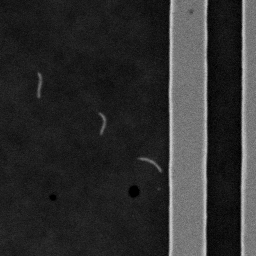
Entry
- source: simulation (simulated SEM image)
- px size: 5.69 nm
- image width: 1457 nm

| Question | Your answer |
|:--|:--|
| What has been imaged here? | wiring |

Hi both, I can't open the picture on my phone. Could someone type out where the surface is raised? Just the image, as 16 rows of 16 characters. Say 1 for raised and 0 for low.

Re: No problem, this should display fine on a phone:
0000000000011001
0000000000011001
0000000000011001
0000000000011001
0000000000011001
0000000000011001
0000000000011001
0000000000011001
0000000000011001
0000000000011001
0000000000011001
0000000000011001
0000000000011001
0000000000011001
0000000000011001
0000000000011001